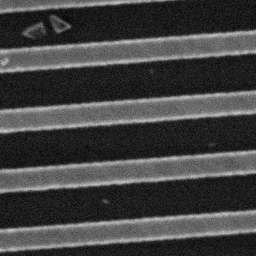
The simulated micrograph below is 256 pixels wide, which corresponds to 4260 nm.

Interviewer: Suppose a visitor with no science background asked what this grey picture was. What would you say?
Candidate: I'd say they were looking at lines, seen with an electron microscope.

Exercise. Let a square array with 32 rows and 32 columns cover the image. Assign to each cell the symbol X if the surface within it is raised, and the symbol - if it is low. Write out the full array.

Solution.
XXXXXXXXXXXXX-------------------
--------------------------------
-------X------------------------
----X--X------------------------
------------------------XXXXXXXX
------------XXXXXXXXXXXXXXXXXXXX
XXXXXXXXXXXXXXXXXXXXXXXXXXXXXXXX
XXXXXXXXXXXXXXXXXXX-------------
XXXXXXX-------------------------
--------------------------------
--------------------------------
--------------------------------
------------------XXXXXXXXXXXXXX
------XXXXXXXXXXXXXXXXXXXXXXXXXX
XXXXXXXXXXXXXXXXXXXXXXXXXX------
XXXXXXXXXXXXX-------------------
X-------------------------------
--------------------------------
--------------------------------
-------------------------XXXXXXX
------------XXXXXXXXXXXXXXXXXXXX
XXXXXXXXXXXXXXXXXXXXXXXXXXXXXXXX
XXXXXXXXXXXXXXXXXXXX------------
XXXXXX--------------------------
--------------------------------
--------------------------------
-------------------------------X
-----------------XXXXXXXXXXXXXXX
----XXXXXXXXXXXXXXXXXXXXXXXXXXXX
XXXXXXXXXXXXXXXXXXXXXXXX--------
XXXXXXXXXXX---------------------
--------------------------------